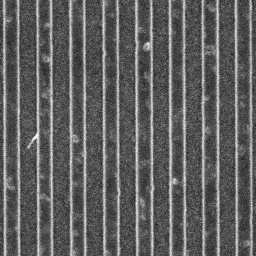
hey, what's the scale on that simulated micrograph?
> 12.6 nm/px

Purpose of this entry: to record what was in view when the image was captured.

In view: parallel lines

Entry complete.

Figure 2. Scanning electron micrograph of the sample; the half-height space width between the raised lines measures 234 nanometers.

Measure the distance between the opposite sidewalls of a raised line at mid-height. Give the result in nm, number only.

191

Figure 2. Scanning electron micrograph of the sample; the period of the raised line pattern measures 419 nm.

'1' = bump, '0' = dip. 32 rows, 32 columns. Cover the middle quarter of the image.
00111000001110000011110000011100
00111000001110000011110000011100
00111000001110000011110000011100
00111000001110000011110000011100
00111000001110000011110000011100
00111000001110000011110000011100
00111000001110000011110000011100
00111000001110000011110000011100
00111000001110000011110000011100
00111000001110000011110000011100
00111000001110000011110000011100
00111000001110000011110000011100
00111000001110000011110000011100
00111000001110000011110000011100
00111000001110000011110000011100
00111000001110000011110000011100
00111000001110000011110000011100
00111000001110000011110000011100
00111000001110000011110000011100
00111000001110000011110000011100
00111000001110000011110000011100
00111000001111000011110000011100
00111000001111000011110000011100
00111000001111000011110000011100
00111000001111000011110000011100
00111000001111000011110000011100
00111000001111000011110000011100
00111000001111000011110000011100
00111000001111000011110000011100
00111000001111000011110000011100
00111000001111000011110000011100
00111000001111000011110000011100